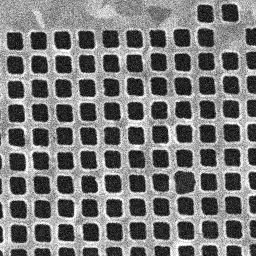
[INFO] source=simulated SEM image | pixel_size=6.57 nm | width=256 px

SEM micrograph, a regular array of holes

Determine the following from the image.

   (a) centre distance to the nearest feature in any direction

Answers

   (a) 155 nanometers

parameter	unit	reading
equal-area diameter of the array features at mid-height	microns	0.126